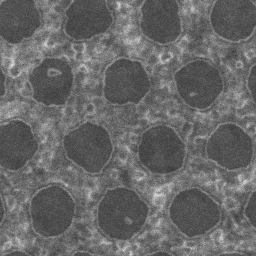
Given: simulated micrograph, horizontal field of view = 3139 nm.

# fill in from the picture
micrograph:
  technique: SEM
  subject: a regular array of raised bodies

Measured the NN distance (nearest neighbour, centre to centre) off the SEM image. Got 0.856 micrometres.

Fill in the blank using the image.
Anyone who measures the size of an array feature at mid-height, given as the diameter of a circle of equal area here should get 0.604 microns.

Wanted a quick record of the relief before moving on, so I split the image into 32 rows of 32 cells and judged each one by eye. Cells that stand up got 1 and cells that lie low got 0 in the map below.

11110000011110000011110000011111
11111000111111000011110000111111
11111000111111000011111000111111
11111000111111000011111000011111
11110000111100000011111000011110
00000000000000000000100000000000
00000000000000000000000001000000
00000111000000111000000000000000
00001111100001111100000111100001
10001111100001111110001111110001
10001111100001111110001111110001
10001111100001111110001111110001
00001111100001111100000111100000
00000000000000000000000011000000
00000000000000000000000000000000
01100000001100000000000000001000
11110000011111000011110000011110
11111000111111000011111000111111
11111000111111000111111000111111
11110000111111000111111000111111
11100000011110000011111000011110
00000000000100000001110000000000
00000000000000000000000000000000
00000111000000110000000010000000
00001111100001111000001111000001
11001111100011111100011111100001
10001111100011111110011111100011
00001111100011111100011111100001
00001111100011111100001111100000
00000110000001111000000110000000
00000000000000000000000000000000
01100000001000000001100000000000